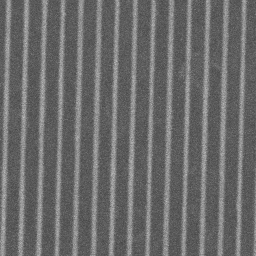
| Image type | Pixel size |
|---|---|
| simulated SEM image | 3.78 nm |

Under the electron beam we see parallel lines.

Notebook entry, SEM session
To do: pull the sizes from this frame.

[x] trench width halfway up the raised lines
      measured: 0.0533 µm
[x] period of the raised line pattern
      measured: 68.4 nanometers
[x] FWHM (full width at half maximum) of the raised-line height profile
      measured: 0.0165 µm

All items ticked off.